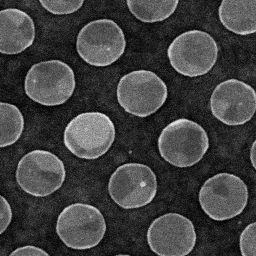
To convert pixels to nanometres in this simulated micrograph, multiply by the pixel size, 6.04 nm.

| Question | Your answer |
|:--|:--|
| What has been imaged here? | a regular array of raised bodies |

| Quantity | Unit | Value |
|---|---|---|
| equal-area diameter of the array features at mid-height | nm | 283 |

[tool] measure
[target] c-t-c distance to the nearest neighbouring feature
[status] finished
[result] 65 px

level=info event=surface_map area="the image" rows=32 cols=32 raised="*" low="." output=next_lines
.....*****......******......****
***...***........*****.....*****
****..............**........****
****......*****.............****
****......*****.......****......
****......******.....******.....
**........*****......******.....
...........***.......******.....
....*****.............****......
...******.......****............
...******......*****........***.
...******......******......*****
....****.......******.....******
**.............*****......******
***.......***..............*****
***......*****.......****...**..
***.....******......******......
**......******......******......
.........*****......******......
...****...**........*****......*
..******.............***........
..******......*****.............
..******......*****.......****..
...****.......******.....******.
..............*****......******.
*..............***.......******.
*.......****..............****..
*......******......*****........
*......******......*****.......*
.......******......*****......**
........****.......*****......**
..***..............*****......**